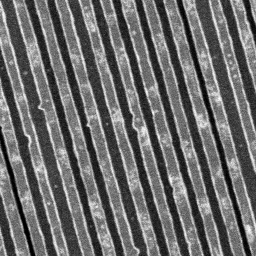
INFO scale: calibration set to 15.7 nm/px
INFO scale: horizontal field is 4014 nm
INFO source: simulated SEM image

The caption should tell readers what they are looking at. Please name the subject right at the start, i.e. parallel lines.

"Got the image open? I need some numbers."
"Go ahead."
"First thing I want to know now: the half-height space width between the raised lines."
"149 nm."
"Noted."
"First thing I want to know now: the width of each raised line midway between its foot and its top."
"174 nanometers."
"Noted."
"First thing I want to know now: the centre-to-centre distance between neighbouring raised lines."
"329 nm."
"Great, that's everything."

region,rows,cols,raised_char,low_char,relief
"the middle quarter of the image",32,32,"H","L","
LLHHHLLLHHHLLLHHLLLHHHLLHHHLLHHH
LLLHHLLLLHHLLLHHHLLHHHLLLHHLLLHH
HLLHHHLLLHHHLLHHHLLHHHLLLHHHLLHH
HLLHHHLLLHHHLLLHHLLLHHHLLHHHLLHH
HLLHHHLLLHHHLLLHHLLLHHHLLHHHLLLH
HLLLHHLLLLHHLLLHHLLLHHHLLLHHLLLH
HLLLHHHLLLHHHLLLHHLLHHHLLLHHHLLH
HHLLHHHLLLHHHLLLHHLLLHHHLLHHHLLH
HHLLLHHLLLHHHLLLHHLLLHHHLLHHHLLL
HHLLLHHHLLLHHLLLHHHLLHHHLLLHHLLL
HHHLLHHHLLLHHHLLHHHLLLHHLLLHHLLL
HHHLLHHHLLLHHHLLLHHLLLHHHLLHHHLL
HHHLLLHHLLLLHHLLLHHLLLHHHLLHHHLL
LHHHLLHHHLLLHHLLLHHHLLHHHLLLHHLL
LHHHLLHHHLLLHHHLLHHHLLLHHLLLHHHL
LHHHLLHHHLLLHHHLLHHHLLLHHHLLHHHL
LLHHLLLHHHLLLHHLLLHHHLLHHHLLHHHL
LLHHHLLHHHLLLHHHLLLHHLLHHHLLLHHH
LLHHHLLHHHLLLHHHLLLHHLLLHHHLLHHH
LLHHHLLHHHHLLHHHLLLHHLLLHHHLLHHH
LLLHHLLLHHHLLLHHHLLHHHLLHHHLLHHH
LLLHHHLLHHHLLLHHHLLHHHLLHHHLLLHH
HLLHHHLLHHHLLLHHHLLLHHLLLHHHLLHH
HLLHHHLLLHHLLLLHHLLLHHHLLHHHLLHH
HLLLHHLLLHHHLLLHHHLLHHHLLHHHLLHH
HLLLHHHLLHHHLLLHHHLLHHHLLLHHLLLH
HHLLHHHLLHHHLLLHHHLLLHHLLLHHHLLH
HHLLHHHLLLHHLLLLHHHLLHHHLLHHHLLH
HHLLLHHLLLHHHLLLHHHLLHHHLLHHHLLL
HHHLLHHHLLHHHLLLHHHLLHHHLLLHHHLL
HHHLLHHHLLLHHHLLHHHLLLHHHLLHHHLL
HHHLLLHHLLLHHHLLLHHHLLHHHLLHHHLL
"